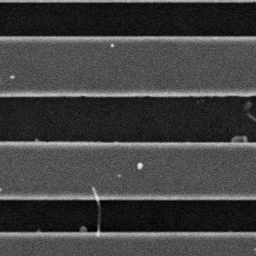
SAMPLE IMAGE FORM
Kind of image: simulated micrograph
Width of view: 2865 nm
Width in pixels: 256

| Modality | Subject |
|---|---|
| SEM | lines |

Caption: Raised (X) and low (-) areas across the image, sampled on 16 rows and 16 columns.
----------------
----------------
XXXXXXXXXXXXXXXX
XXXXXXXXXXXXXXXX
XXXXXXXXXXXXXXXX
XXXXXXXXXXXXXXXX
----------------
----------------
----------------
XXXXXXXXXXXXXXXX
XXXXXXXXXXXXXXXX
XXXXXXXXXXXXXXXX
------X---------
----------------
------X---------
XXXXXXXXXXXXXXXX